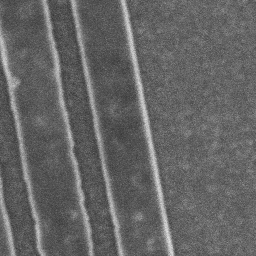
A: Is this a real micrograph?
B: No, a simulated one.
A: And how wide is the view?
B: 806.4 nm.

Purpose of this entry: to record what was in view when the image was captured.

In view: one or a few lines or trenches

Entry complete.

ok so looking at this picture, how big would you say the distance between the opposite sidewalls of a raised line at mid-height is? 161 nanometres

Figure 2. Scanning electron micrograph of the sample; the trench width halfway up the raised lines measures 0.0821 micrometres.